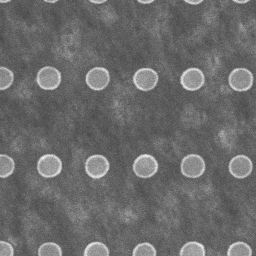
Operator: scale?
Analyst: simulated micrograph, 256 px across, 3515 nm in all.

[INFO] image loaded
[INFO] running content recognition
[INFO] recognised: a regular array of raised bodies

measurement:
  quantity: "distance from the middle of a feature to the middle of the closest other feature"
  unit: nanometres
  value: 654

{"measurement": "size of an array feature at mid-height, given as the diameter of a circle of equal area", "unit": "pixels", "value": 22.5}